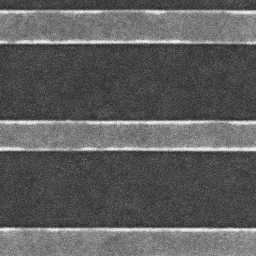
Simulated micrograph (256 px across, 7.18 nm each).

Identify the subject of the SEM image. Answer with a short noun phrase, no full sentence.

one or a few lines or trenches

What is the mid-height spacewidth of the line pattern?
561 nm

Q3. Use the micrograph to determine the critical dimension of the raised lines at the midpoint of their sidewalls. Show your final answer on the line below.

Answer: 223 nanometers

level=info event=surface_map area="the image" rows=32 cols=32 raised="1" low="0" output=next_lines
00000000000000000000000000000000
11111111111111111111111111111111
11111111111111111111111111111111
11111111111111111111111111111111
11111111111111111111111111111111
00000000000000000000000000000000
00000000000000000000000000000000
00000000000000000000000000000000
00000000000000000000000000000000
00000000000000000000000000000000
00000000000000000000000000000000
00000000000000000000000000000000
00000000000000000000000000000000
00000000000000000000000000000000
00000000000000000000000000000000
11111111111111111111111111111111
11111111111111111111111111111111
11111111111111111111111111111111
11111111111111111111111111111111
00000000000000000000000000000000
00000000000000000000000000000000
00000000000000000000000000000000
00000000000000000000000000000000
00000000000000000000000000000000
00000000000000000000000000000000
00000000000000000000000000000000
00000000000000000000000000000000
00000000000000000000000000000000
00000000000000000000000000000000
11111111111111111111111111111111
11111111111111111111111111111111
11111111111111111111111111111111